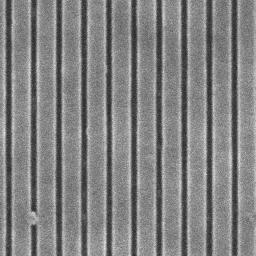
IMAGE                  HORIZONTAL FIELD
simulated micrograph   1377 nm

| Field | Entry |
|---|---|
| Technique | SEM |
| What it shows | parallel lines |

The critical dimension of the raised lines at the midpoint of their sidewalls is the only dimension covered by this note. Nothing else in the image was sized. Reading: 98.1 nm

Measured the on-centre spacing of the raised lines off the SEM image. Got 25.1 px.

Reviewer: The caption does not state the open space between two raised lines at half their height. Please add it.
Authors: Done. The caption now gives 0.0363 µm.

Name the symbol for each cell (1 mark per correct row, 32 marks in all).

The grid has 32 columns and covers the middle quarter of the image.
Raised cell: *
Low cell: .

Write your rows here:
****..*****.*****..****..****..*
****..*****.*****..****..****..*
****..****..*****..****..****..*
****..****..*****..****..****..*
****..****..*****..****..****..*
****..****..*****..****..****..*
****..****..*****..****..****..*
****..****..****...****..****..*
****..****..****...****..****..*
****..****..****...****..****..*
****..****..****...****..****..*
****..****..****...****..****..*
****..****..****...****..****..*
****..****..****...****..****..*
****..****..****...****..****..*
****..****..*****..****..****..*
****..****..*****..****..****..*
****..****..*****..****..****..*
****..****..*****..****..****..*
****..****..*****..****..****..*
****..****..****...****..****..*
****..****..****...****..****..*
****..****..*****..****..****..*
****..****..*****..****..****..*
****..****..*****..****..****..*
****..****..****...****..****..*
****..****..****...****..****..*
****..****..****...****..****..*
****..****..****...****..****..*
****..****..****...****..****..*
****..****..****...****..****..*
****..****..*****..****..****..*